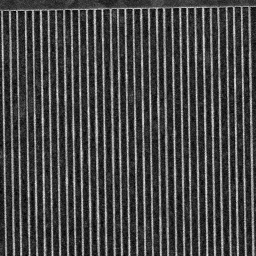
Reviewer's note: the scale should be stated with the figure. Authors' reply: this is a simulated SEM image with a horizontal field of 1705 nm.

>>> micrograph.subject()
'parallel lines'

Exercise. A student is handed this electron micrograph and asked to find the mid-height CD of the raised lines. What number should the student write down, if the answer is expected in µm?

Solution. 0.0092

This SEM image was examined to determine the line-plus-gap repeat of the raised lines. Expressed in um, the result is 0.0514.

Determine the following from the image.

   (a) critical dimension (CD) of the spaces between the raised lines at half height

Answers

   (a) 40.8 nm